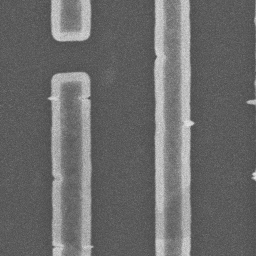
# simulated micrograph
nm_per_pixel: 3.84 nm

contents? one or a few lines or trenches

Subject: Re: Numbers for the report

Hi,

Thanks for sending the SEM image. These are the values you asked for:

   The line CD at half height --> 0.106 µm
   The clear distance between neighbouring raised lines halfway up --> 281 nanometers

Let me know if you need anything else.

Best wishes